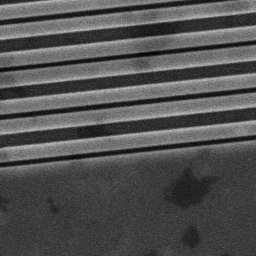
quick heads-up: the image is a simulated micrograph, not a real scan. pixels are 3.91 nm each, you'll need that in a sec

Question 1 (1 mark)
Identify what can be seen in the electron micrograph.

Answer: parallel lines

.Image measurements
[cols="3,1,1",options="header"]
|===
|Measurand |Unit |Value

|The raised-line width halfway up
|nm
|56.3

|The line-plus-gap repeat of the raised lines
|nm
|94.4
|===